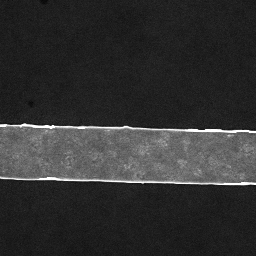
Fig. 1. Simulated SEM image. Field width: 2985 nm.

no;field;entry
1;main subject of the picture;one or a few lines or trenches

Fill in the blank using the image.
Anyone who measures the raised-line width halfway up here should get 0.632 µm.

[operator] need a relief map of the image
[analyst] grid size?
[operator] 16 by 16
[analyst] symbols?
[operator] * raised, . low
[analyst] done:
................
................
................
................
................
................
................
................
****************
****************
****************
.............***
................
................
................
................